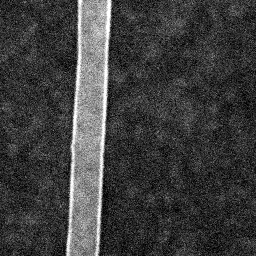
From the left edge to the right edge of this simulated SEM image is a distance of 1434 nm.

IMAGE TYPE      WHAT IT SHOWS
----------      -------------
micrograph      one or a few lines or trenches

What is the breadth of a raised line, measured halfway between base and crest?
0.159 micrometres